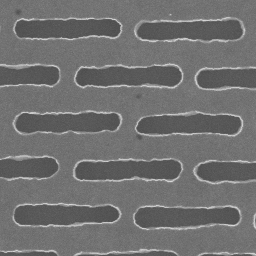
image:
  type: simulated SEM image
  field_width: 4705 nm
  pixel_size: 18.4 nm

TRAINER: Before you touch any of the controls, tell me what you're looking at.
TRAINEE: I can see a regular array of holes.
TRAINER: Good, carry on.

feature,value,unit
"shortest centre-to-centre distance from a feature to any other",1430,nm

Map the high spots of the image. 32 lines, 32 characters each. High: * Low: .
********************************
********************************
****..........**************..**
**.............**.............**
**.........*..***.............**
********************************
********************************
********************************
..*....******.........**********
.......**..............**.......
.......***............***.......
********************************
********************************
********************************
**.............*****.........***
**.............**.............**
***.*...**..*****.............**
********************************
********************************
********************************
.......***............***.......
.......**..............**.......
***********.**.***********......
********************************
********************************
********************************
**.............**.............**
**............***.............**
******************.*************
********************************
********************************
*......***********...***********